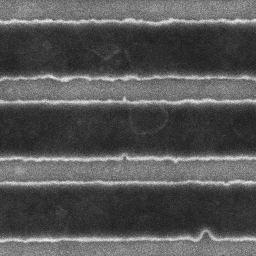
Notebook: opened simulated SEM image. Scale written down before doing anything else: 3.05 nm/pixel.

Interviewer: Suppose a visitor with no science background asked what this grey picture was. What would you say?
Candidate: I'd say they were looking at one or a few lines or trenches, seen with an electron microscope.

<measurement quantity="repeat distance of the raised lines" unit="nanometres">246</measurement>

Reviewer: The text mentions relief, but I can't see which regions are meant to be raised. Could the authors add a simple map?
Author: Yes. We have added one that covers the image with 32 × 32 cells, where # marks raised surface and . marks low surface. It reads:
................................
................................
....#......#.#..#....#.........#
################################
################################
################################
################################
################################
################################
################################
................................
................................
.......................#........
################################
################################
################################
################################
################################
################################
################################
................................
................................
................................
################################
################################
################################
################################
################################
################################
#########################.######
................................
................................